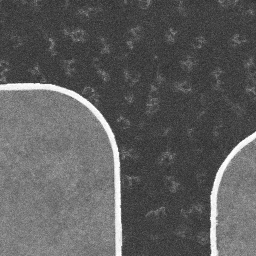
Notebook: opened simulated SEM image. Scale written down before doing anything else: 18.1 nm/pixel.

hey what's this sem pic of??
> one or a few lines or trenches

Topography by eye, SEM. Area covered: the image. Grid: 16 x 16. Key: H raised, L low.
HHHHHHHHHHHHHHHH
HHHHHHHHHHHHHHHH
HHHHHHHHHHHHHHHH
HHHHHHHHHHHHHHHH
HHHHHHHHHHHHHHHH
LLLHHHHHHHHHHHHH
LLLLLHHHHHHHHHHH
LLLLLLHHHHHHHHHH
LLLLLLLHHHHHHHHH
LLLLLLLHHHHHHHHL
LLLLLLLHHHHHHHLL
LLLLLLLHHHHHHHLL
LLLLLLLHHHHHHLLL
LLLLLLLHHHHHHLLL
LLLLLLLHHHHHHLLL
LLLLLLLHHHHHHLLL